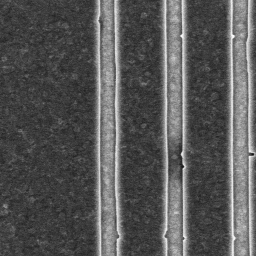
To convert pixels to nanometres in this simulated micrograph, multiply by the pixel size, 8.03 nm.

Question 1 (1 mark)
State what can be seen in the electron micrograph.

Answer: one or a few lines or trenches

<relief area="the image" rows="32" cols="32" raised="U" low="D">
UUUUUUUUUUUUDDUUUUUUUDDUUUUUUDDU
UUUUUUUUUUUUDDUUUUUUUDDUUUUUUDDU
UUUUUUUUUUUUDDUUUUUUUDDUUUUUUDDU
UUUUUUUUUUUUDDUUUUUUUDDUUUUUUDDU
UUUUUUUUUUUUDDUUUUUUUDDUUUUUUDDU
UUUUUUUUUUUUDDUUUUUUUDDUUUUUUDDU
UUUUUUUUUUUUDDUUUUUUUDDUUUUUUDDU
UUUUUUUUUUUUDDDUUUUUUDDUUUUUUDDU
UUUUUUUUUUUUDDDUUUUUUDDUUUUUUDDU
UUUUUUUUUUUUDDDUUUUUUDDUUUUUUDDU
UUUUUUUUUUUUDDDUUUUUUDDUUUUUUDDU
UUUUUUUUUUUUDDDUUUUUUDDUUUUUUDDU
UUUUUUUUUUUUDDUUUUUUUDDUUUUUUDDU
UUUUUUUUUUUUDDUUUUUUUDDUUUUUUDDU
UUUUUUUUUUUUDDUUUUUUUDDUUUUUUDDU
UUUUUUUUUUUUDDDUUUUUUDDUUUUUUDDU
UUUUUUUUUUUUDDDUUUUUUDDUUUUUUDDU
UUUUUUUUUUUUDDDUUUUUUDDUUUUUUDDU
UUUUUUUUUUUUDDUUUUUUUDDUUUUUUDDU
UUUUUUUUUUUUDDUUUUUUUDDUUUUUUDDU
UUUUUUUUUUUUDDUUUUUUUDDUUUUUUDDU
UUUUUUUUUUUUDDUUUUUUUDDUUUUUUDDU
UUUUUUUUUUUUDDUUUUUUUDDUUUUUUDDU
UUUUUUUUUUUUDDUUUUUUUDDUUUUUUDDU
UUUUUUUUUUUUDDUUUUUUUDDUUUUUUDDU
UUUUUUUUUUUUDDDUUUUUUDDUUUUUUDDU
UUUUUUUUUUUUDDDUUUUUUDDUUUUUUDDU
UUUUUUUUUUUUUDDUUUUUUDDUUUUUUDDU
UUUUUUUUUUUUUDDUUUUUUDDUUUUUUDDU
UUUUUUUUUUUUUDDUUUUUUDDUUUUUUDDU
UUUUUUUUUUUUUDDUUUUUUDDUUUUUUDDU
UUUUUUUUUUUUUDDUUUUUUDDUUUUUUDDU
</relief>